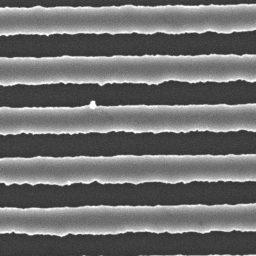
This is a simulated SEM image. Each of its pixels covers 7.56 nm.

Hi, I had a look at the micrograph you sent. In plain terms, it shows lines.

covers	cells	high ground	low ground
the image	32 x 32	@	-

--------------------------------
@@@@@@@@@@@@@@@@@@@@@@@@@@@@@@@@
@@@@@@@@@@@@@@@@@@@@@@@@@@@@@@@@
@@@@@@@@@@@@@@@@@@@@@@@@@@@@@@@@
--------------------------------
--------------------------------
--------------------------------
@@@@@@@@@@@@@@@@@@@@@@@@@@@@@@@@
@@@@@@@@@@@@@@@@@@@@@@@@@@@@@@@@
@@@@@@@@@@@@@@@@@@@@@@@@@@@@@@@@
@@-@@-------@-------------------
--------------------------------
--------------------------------
@@-@@@@@@@@@@@@@@@@@@@@@@@@@@@@@
@@@@@@@@@@@@@@@@@@@@@@@@@@@@@@@@
@@@@@@@@@@@@@@@@@@@@@@@@@@@@@@@@
@@@@@@@@@@@@@---@@-@------------
--------------------------------
--------------------------------
---------------@@@@@@@@@@@@@@@@@
@@@@@@@@@@@@@@@@@@@@@@@@@@@@@@@@
@@@@@@@@@@@@@@@@@@@@@@@@@@@@@@@@
@@@@@@@@@@@@@@@@@@@@@@@@@@@@@@@@
--------------------------------
--------------------------------
-------------------------------@
@@@@@@@@@@@@@@@@@@@@@@@@@@@@@@@@
@@@@@@@@@@@@@@@@@@@@@@@@@@@@@@@@
@@@@@@@@@@@@@@@@@@@@@@@@@@@@@@@@
--------------------------------
--------------------------------
--------------------------------